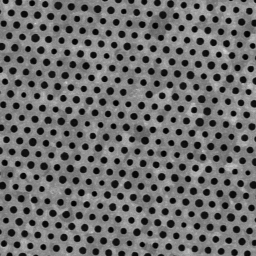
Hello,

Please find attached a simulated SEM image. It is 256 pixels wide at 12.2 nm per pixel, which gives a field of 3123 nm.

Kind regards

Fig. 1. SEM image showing a regular array of holes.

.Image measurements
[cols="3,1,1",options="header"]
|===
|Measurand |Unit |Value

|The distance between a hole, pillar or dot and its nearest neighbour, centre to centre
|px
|12.9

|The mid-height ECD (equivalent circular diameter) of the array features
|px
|7.05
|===